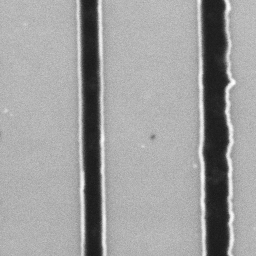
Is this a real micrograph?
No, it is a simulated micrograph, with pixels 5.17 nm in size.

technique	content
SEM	one or a few lines or trenches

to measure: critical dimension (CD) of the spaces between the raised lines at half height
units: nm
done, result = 505